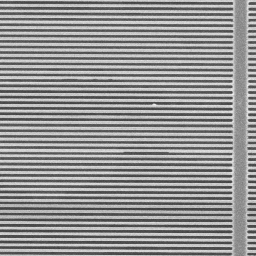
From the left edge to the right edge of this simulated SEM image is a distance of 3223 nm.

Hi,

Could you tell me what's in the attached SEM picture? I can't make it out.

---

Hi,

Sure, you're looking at parallel lines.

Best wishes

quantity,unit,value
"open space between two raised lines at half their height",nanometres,36.2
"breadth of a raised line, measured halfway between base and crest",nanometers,34.6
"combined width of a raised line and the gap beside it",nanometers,70.1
